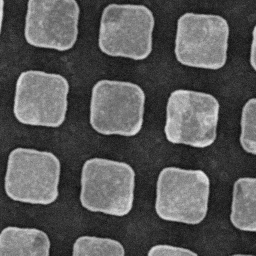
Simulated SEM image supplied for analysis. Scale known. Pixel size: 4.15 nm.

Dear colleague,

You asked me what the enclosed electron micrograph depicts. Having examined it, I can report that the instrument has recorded a regular array of raised bodies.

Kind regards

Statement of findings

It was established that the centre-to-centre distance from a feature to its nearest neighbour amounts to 0.315 micrometres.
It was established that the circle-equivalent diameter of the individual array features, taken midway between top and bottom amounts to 0.231 micrometres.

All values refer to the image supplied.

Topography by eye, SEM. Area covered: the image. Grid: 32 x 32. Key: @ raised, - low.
----@@@@@-----------------------
----@@@@@@---@@@@@@-------------
---@@@@@@@---@@@@@@----@@@@@----
---@@@@@@@---@@@@@@---@@@@@@----
---@@@@@@----@@@@@@---@@@@@@----
----@@@@@----@@@@@@---@@@@@@----
-------------@@@@@@---@@@@@@---@
----------------------@@@@@@---@
--------------------------@-----
---@@@@-------------------------
--@@@@@@----@@@@----------------
--@@@@@@----@@@@@@----@@--------
--@@@@@@----@@@@@@---@@@@@@-----
--@@@@@@----@@@@@@---@@@@@@----@
--@@@@@@---@@@@@@@---@@@@@@---@@
----@@@-----@@@@@@---@@@@@@---@@
-------------@@@@----@@@@@@---@@
---------------------@@@@@@---@@
-------------------------------@
-@@@@@@-------------------------
-@@@@@@----@@@@-----------------
-@@@@@@---@@@@@@@---@@@@@-------
-@@@@@@---@@@@@@@---@@@@@@----@@
-@@@@@@---@@@@@@----@@@@@@---@@@
-@@@@@@---@@@@@@----@@@@@@---@@@
----------@@@@@@----@@@@@@---@@@
-------------@@@----@@@@@@---@@@
----------------------@@@----@@@
------------------------------@@
@@@@@@--------------------------
@@@@@@---@@@@@@-----------------
@@@@@@---@@@@@@----@@@@@--------